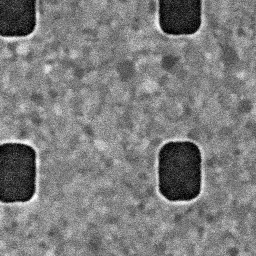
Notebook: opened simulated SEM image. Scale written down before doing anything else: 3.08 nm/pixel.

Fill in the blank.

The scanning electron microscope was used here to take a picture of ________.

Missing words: holes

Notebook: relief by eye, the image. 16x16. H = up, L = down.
LLHHHHHHHHLLLHHH
LLHHHHHHHHLLLHHH
HHHHHHHHHHHHHHHH
HHHHHHHHHHHHHHHH
HHHHHHHHHHHHHHHH
HHHHHHHHHHHHHHHH
HHHHHHHHHHHHHHHH
HHHHHHHHHHHHHHHH
HHHHHHHHHHHHHHHH
LLHHHHHHHHLLHHHH
LLHHHHHHHHLLLHHH
LLHHHHHHHHLLLHHH
LLHHHHHHHHHLHHHH
HHHHHHHHHHHHHHHH
HHHHHHHHHHHHHHHH
HHHHHHHHHHHHHHHH